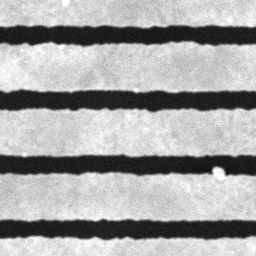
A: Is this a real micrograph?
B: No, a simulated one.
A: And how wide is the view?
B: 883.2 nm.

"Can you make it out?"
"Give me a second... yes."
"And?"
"lines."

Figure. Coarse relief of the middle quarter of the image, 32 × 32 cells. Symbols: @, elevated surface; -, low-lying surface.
@@@@@@@@@@@@@@@@@@@@@@@@@@@@@@@@
@@@@@@@@@@@@@@@@@@@@@@@@@@@@@@@@
@@@@@@@@@@@@@@@@@@@@@@@@@@@@@@@@
@@@@@@@@@@@@@@@@@@@@@@@@@@@@@@@@
@@@@@@@@@@@@@@@@@@@@@@@@@@@@@@@@
@@@@@@@@@@@@@@@@@@@@@@@@@@@@@@@@
@@@@@@----@@-@@@@@@@@@@@@@@@@@@@
--------------------------------
--------------------------------
--------------------------------
--------------------------------
----@@---@@--@@-@@-----------@-@
@@@@@@@@@@@@@@@@@@@@@@@@@@@@@@@@
@@@@@@@@@@@@@@@@@@@@@@@@@@@@@@@@
@@@@@@@@@@@@@@@@@@@@@@@@@@@@@@@@
@@@@@@@@@@@@@@@@@@@@@@@@@@@@@@@@
@@@@@@@@@@@@@@@@@@@@@@@@@@@@@@@@
@@@@@@@@@@@@@@@@@@@@@@@@@@@@@@@@
@@@@@@@@@@@@@@@@@@@@@@@@@@@@@@@@
@@@@@@@@@@@@@@@@@@@@@@@@@@@@@@@@
@@@@@@@@@@@@@@@@@@@@@@@@@@@@@@@@
@@@@@@@@@@@@@@@@@@@@@@@@@@@@@@@@
@@@@@@@@@@@@@@-@@@@@@@@@@@@@@@@@
--------------------------------
--------------------------------
--------------------------------
--------------------------------
@---@@@@@-@@@@@@@---------@@@---
@@@@@@@@@@@@@@@@@@@@@@@@@@@@@@@@
@@@@@@@@@@@@@@@@@@@@@@@@@@@@@@@@
@@@@@@@@@@@@@@@@@@@@@@@@@@@@@@@@
@@@@@@@@@@@@@@@@@@@@@@@@@@@@@@@@